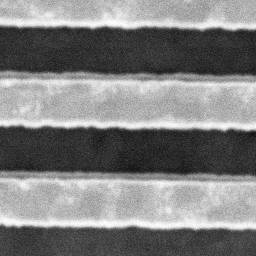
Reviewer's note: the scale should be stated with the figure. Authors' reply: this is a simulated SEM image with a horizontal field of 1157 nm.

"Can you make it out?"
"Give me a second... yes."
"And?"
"lines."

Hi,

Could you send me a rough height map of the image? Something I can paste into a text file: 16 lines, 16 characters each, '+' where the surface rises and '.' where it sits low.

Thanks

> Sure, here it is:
++++++++++++++++
++++++++++++++++
................
................
................
++++++++++++++++
++++++++++++++++
++++++++++++++++
................
................
................
++++++++++++++++
++++++++++++++++
++++++++++++++++
................
................